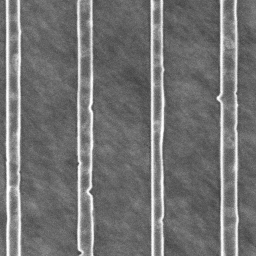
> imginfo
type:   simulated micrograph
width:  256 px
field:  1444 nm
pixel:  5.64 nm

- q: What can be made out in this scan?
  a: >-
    one or a few lines or trenches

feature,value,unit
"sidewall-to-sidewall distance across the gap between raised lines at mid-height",336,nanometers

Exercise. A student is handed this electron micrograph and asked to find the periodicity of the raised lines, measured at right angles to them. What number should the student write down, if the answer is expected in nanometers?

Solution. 406